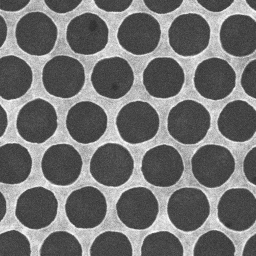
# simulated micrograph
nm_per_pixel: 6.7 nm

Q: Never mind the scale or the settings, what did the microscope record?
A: a regular array of holes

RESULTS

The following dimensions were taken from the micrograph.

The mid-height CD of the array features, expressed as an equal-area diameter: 287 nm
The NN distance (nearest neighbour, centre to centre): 332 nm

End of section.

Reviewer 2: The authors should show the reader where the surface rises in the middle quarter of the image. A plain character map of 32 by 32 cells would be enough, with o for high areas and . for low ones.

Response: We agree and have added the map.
.....ooo.........oooo........ooo
.....oo..........ooo..........oo
.....oo..........ooo..........oo
.....oo...........oo..........oo
.....oo..........ooo..........oo
.....oo..........ooo..........oo
....oooo........ooooo........ooo
...oooooo.......ooooo........ooo
.oooooooooo...oooooooooo..oooooo
oooo...oooooooooo....oooooooo...
oo.......oooooo.......oooooo....
o.........oooo.........oooo.....
o..........ooo..........oo......
o..........oo...........oo......
...........oo...........oo......
...........oo...........oo......
o..........oo...........oo......
o.........oooo.........ooo......
oo.......ooooo........ooooo.....
ooo.....oooooooo....ooooooooo...
..ooooooo......oooooooo....ooooo
...ooooo........ooooo.......oooo
....ooo..........ooo.........ooo
....ooo..........ooo.........ooo
.....oo...........o...........oo
.....o............o...........oo
....oo...........oo...........oo
....ooo..........ooo..........oo
...ooooo.........ooo.........ooo
...oooooo.......ooooo.......oooo
oooooo.oooo...oooooooo.....ooooo
ooo......ooooooo.....ooooooo....